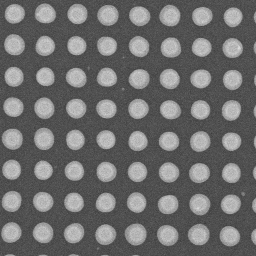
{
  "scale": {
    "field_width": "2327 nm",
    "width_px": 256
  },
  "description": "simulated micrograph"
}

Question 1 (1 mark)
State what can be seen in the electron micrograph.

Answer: an array of small figures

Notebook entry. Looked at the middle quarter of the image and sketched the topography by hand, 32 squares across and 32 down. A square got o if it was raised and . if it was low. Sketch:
................................
..oo.....ooo......oo.....oo.....
.oooo....oooo....oooo...oooo....
.oooo...ooooo...ooooo...ooooo...
.oooo...ooooo...ooooo...ooooo...
..ooo.....oo.....oooo....ooo....
................................
................................
................................
.oooo....ooo.....ooo.....ooo....
.oooo...ooooo...ooooo...ooooo...
.oooo...ooooo...ooooo...ooooo...
.oooo....oooo...ooooo...ooooo...
..oo......o......oo......ooo....
................................
................................
................................
.oooo....ooo.....ooo.....ooo....
.oooo...ooooo...ooooo...ooooo...
.oooo...ooooo...ooooo...ooooo...
.oooo....ooo....ooooo...oooo....
.................oo......oo.....
................................
................................
..oo............................
.oooo....oooo...oooo....oooo....
ooooo...ooooo...ooooo...ooooo...
ooooo...ooooo...ooooo...ooooo..o
.ooo.....oooo...oooo....oooo....
.........................oo.....
................................
................................